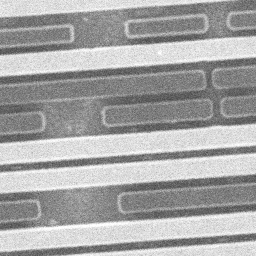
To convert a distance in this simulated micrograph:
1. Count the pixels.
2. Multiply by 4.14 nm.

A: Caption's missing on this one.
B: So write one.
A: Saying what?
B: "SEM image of parallel lines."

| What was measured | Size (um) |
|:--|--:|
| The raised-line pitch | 0.12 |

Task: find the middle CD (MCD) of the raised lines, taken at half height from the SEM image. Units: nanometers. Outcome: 80.6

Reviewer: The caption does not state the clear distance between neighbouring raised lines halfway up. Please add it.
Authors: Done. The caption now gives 40.3 nm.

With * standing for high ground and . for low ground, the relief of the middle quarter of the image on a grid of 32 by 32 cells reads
***************.................
**..............................
........................********
...........*********************
********************************
********************************
********************************
*******************.............
******..........................
............................****
...............*****************
..........**********************
..........**********************
..........**********************
..........**************........
................................
................................
...................*************
......**************************
********************************
********************************
****************************....
***************.................
**..............................
.......................*********
..........**********************
********************************
********************************
********************************
*******************.............
******..........................
...........................*****